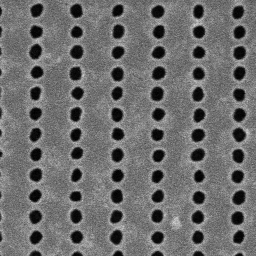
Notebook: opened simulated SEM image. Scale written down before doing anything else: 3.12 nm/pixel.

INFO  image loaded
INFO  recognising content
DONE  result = a regular array of holes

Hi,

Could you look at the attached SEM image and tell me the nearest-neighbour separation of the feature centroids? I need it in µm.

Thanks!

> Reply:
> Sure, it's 0.0634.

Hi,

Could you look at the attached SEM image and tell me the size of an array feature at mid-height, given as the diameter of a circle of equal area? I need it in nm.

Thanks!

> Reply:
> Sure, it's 39.3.